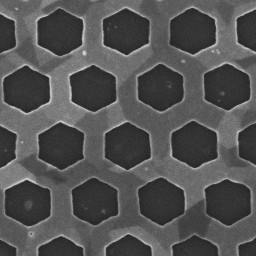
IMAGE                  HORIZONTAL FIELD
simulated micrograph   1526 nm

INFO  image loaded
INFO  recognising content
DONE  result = a regular array of holes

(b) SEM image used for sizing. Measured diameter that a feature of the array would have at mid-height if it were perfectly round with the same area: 0.278 micrometres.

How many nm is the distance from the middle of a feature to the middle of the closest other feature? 388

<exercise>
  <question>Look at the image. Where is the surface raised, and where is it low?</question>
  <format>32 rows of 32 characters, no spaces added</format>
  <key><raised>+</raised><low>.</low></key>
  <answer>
++++++++++++++++++++++++++++++++
+++++++.+++++++..++++++..++++++.
.++++.....+++......++......+++..
..+++.....+++......++......++...
..+++.....+++......++......+++..
..+++.....+++.....+++......+++..
++++++...++++++..++++++..+++++++
++++++++++++++++++++++++++++++++
++..+++++++.+++++++..++++++...++
+.....+++.....+++......++......+
......+++......++......++......+
......+++......++......++......+
......+++......++......+++.....+
++...+++++...++++++..+++++++.+++
++++++++++++++++++++++++++++++++
+++++++.+++++++..++++++..+++++++
..+++.....+++.....++++.....+++..
..+++......++......++......+++..
..+++.....+++......++......+++..
..+++.....+++......+++.....+++..
.+++++...+++++....+++++..+++++++
++++++++++++++++++++++++++++++++
+++++++++++.+++++++..+++++++.+++
+.....+++.....++++.....+++.....+
+.....+++......++......+++.....+
......+++......++......+++.....+
+.....+++......+++.....+++.....+
++....++++...++++++...+++++...++
++++++++++++++++++++++++++++++++
++++++++++++++++.+++++++.+++++++
.++++.....++++....++++.....+++..
..+++.....+++......++......+++..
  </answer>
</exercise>